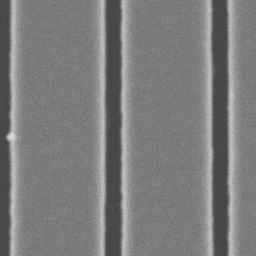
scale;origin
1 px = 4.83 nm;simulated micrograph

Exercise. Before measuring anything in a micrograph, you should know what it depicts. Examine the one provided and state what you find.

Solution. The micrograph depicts lines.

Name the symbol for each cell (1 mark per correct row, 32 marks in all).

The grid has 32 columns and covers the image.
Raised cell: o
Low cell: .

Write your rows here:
.oooooooooooo..ooooooooooo..oooo
.oooooooooooo..ooooooooooo..oooo
.oooooooooooo..ooooooooooo...ooo
.oooooooooooo..ooooooooooo...ooo
.oooooooooooo..ooooooooooo...ooo
.oooooooooooo..ooooooooooo...ooo
.oooooooooooo..ooooooooooo...ooo
.oooooooooooo..ooooooooooo...ooo
.oooooooooooo..ooooooooooo...ooo
.oooooooooooo..ooooooooooo...ooo
.oooooooooooo..ooooooooooo...ooo
.oooooooooooo..ooooooooooo...ooo
.oooooooooooo..ooooooooooo...ooo
.oooooooooooo..ooooooooooo...ooo
.oooooooooooo..ooooooooooo...ooo
.oooooooooooo..ooooooooooo...ooo
.oooooooooooo..ooooooooooo...ooo
.oooooooooooo..ooooooooooo...ooo
.oooooooooooo..oooooooooooo..ooo
.oooooooooooo..oooooooooooo..ooo
.oooooooooooo..ooooooooooo...ooo
.oooooooooooo..ooooooooooo...ooo
.oooooooooooo..ooooooooooo...ooo
.oooooooooooo..ooooooooooo...ooo
.oooooooooooo..ooooooooooo...ooo
.oooooooooooo..ooooooooooo...ooo
.oooooooooooo..ooooooooooo...ooo
.oooooooooooo..oooooooooooo..ooo
.oooooooooooo..ooooooooooo...ooo
.oooooooooooo..oooooooooooo..ooo
.oooooooooooo..oooooooooooo..ooo
.oooooooooooo..oooooooooooo..ooo